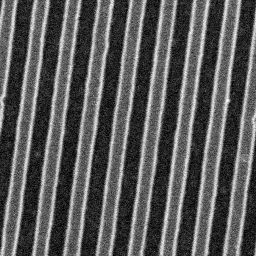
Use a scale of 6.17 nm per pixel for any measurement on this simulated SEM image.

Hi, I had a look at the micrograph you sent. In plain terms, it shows parallel lines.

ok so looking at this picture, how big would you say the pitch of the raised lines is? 195 nm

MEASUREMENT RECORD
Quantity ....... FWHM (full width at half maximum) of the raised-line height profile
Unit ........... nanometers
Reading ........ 85.6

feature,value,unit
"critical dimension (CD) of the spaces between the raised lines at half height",114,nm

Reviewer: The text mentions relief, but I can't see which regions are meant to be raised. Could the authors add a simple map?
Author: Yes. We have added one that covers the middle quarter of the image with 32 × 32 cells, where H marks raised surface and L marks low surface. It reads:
HHLLLLLHHHLLLLLHHHLLLLLHHHLLLLLH
HHLLLLHHHHLLLLLHHHLLLLHHHHLLLLHH
HLLLLLHHHHLLLLHHHHLLLLHHHLLLLLHH
HLLLLLHHHLLLLLHHHLLLLLHHHLLLLLHH
HLLLLLHHHLLLLLHHHLLLLLHHHLLLLLHH
HLLLLLHHHLLLLLHHHLLLLLHHHLLLLLHH
HLLLLLHHHLLLLLHHHLLLLLHHHLLLLLHH
HLLLLLHHHLLLLLHHHLLLLLHHHLLLLLHH
HLLLLHHHHLLLLLHHHLLLLLHHHLLLLHHH
LLLLLHHHHLLLLHHHHLLLLHHHHLLLLHHH
LLLLLHHHHLLLLHHHHLLLLHHHHLLLLHHH
LLLLLHHHLLLLLHHHHLLLLHHHLLLLLHHH
LLLLLHHHLLLLLHHHLLLLLHHHLLLLLHHH
LLLLLHHHLLLLLHHHLLLLLHHHLLLLLHHH
LLLLLHHHLLLLLHHHLLLLLHHHLLLLLHHH
LLLLLHHHLLLLHHHHLLLLLHHHLLLLLHHH
LLLLHHHHLLLLHHHHLLLLHHHHLLLLHHHH
LLLLHHHHLLLLHHHHLLLLHHHHLLLLHHHH
LLLLHHHLLLLLHHHLLLLLHHHLLLLLHHHL
LLLLHHHLLLLLHHHLLLLLHHHLLLLLHHHL
LLLLHHHLLLLLHHHLLLLLHHHLLLLLHHHL
LLLLHHHLLLLLHHHLLLLLHHHLLLLLHHHL
LLLLHHHLLLLLHHHLLLLLHHHLLLLLHHHL
LLLHHHHLLLLLHHHLLLLLHHHLLLLHHHHL
LLLHHHHLLLLHHHHLLLLHHHHLLLLHHHHL
LLLHHHHLLLLHHHLLLLLHHHHLLLLHHHHL
LLLHHHLLLLLHHHLLLLLHHHLLLLLHHHLL
LLLHHHLLLLLHHHLLLLLHHHLLLLLHHHLL
LLLHHHLLLLLHHHLLLLLHHHLLLLLHHHLL
LLLHHHLLLLLHHHLLLLLHHHLLLLLHHHLL
LLLHHHLLLLLHHHLLLLLHHHLLLLLHHHLL
LLHHHLLLLLLHHHLLLLHHHHLLLLHHHHLL